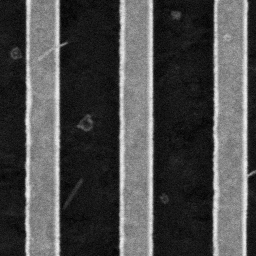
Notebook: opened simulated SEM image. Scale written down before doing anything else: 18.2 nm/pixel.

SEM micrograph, lines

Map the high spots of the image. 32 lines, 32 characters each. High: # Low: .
...####........####........####.
...####........####........####.
...####........####........####.
...####........####........####.
...####........####........####.
...####........####........####.
...####........####........####.
...####........####........####.
...####........####........####.
...####........####........####.
...####........####........####.
...####........####........####.
...####........####........####.
...####........####........####.
...####........####........####.
...####........####........####.
...####........####........####.
...####........####........####.
...####........####........####.
...####........####........####.
...####........####........####.
...####........####........####.
...####........####........####.
...####........####........####.
...####........####........####.
...####........####........####.
...####........####........####.
...####........####........####.
...####........####........####.
...####........####........####.
...####........####........####.
...####........####........####.